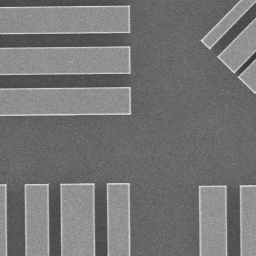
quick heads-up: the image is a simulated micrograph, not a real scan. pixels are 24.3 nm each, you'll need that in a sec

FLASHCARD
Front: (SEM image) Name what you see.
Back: groups of lines, slits or small figures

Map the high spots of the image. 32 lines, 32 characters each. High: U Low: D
DDDDDDDDDDDDDDDDDDDDDDDDDDDDDDUU
UUUUUUUUUUUUUUUUDDDDDDDDDDDDDUUD
UUUUUUUUUUUUUUUUDDDDDDDDDDDDUUDD
UUUUUUUUUUUUUUUUDDDDDDDDDDDUUDDU
DDDDDDDDDDDDDDDDDDDDDDDDDDUUDDUU
DDDDDDDDDDDDDDDDDDDDDDDDDDUDDUUU
UUUUUUUUUUUUUUUUDDDDDDDDDDDDUUUU
UUUUUUUUUUUUUUUUDDDDDDDDDDDDUUUD
UUUUUUUUUUUUUUUUDDDDDDDDDDDDDUDU
DDDDDDDDDDDDDDDDDDDDDDDDDDDDDDUU
DDDDDDDDDDDDDDDDDDDDDDDDDDDDDDDU
UUUUUUUUUUUUUUUUDDDDDDDDDDDDDDDD
UUUUUUUUUUUUUUUUDDDDDDDDDDDDDDDD
UUUUUUUUUUUUUUUUDDDDDDDDDDDDDDDD
DDDDDDDDDDDDDDDDDDDDDDDDDDDDDDDD
DDDDDDDDDDDDDDDDDDDDDDDDDDDDDDDD
DDDDDDDDDDDDDDDDDDDDDDDDDDDDDDDD
DDDDDDDDDDDDDDDDDDDDDDDDDDDDDDDD
DDDDDDDDDDDDDDDDDDDDDDDDDDDDDDDD
DDDDDDDDDDDDDDDDDDDDDDDDDDDDDDDD
DDDDDDDDDDDDDDDDDDDDDDDDDDDDDDDD
DDDDDDDDDDDDDDDDDDDDDDDDDDDDDDDD
DDDDDDDDDDDDDDDDDDDDDDDDDDDDDDDD
UDDUUUDDUUUUDUUUDDDDDDDDDUUUDDUU
UDDUUUDDUUUUDUUUDDDDDDDDDUUUDDUU
UDDUUUDDUUUUDUUUDDDDDDDDDUUUDDUU
UDDUUUDDUUUUDUUUDDDDDDDDDUUUDDUU
UDDUUUDDUUUUDUUUDDDDDDDDDUUUDDUU
UDDUUUDDUUUUDUUUDDDDDDDDDUUUDDUU
UDDUUUDDUUUUDDUUDDDDDDDDDUUUDDUU
UDDUUUDDUUUUDDUUDDDDDDDDDUUUDDUU
UDDUUUDDUUUUDDUUDDDDDDDDDUUUDDUU